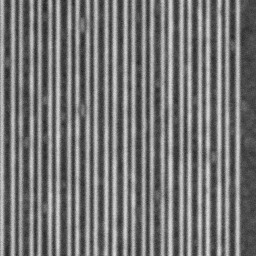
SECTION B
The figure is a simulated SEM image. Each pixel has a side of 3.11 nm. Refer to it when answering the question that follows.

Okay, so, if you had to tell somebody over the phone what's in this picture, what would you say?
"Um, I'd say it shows parallel lines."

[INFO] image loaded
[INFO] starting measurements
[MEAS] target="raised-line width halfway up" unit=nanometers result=8.2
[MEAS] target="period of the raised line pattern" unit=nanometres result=29.2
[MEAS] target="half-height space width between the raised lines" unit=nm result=24.5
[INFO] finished